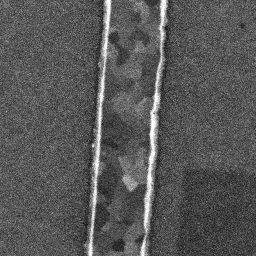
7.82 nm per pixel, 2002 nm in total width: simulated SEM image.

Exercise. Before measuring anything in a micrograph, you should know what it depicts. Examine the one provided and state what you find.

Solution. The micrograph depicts one or a few lines or trenches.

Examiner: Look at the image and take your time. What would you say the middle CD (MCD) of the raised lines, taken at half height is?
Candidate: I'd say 0.42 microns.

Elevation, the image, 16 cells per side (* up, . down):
.......***......
.......***......
.......***......
.......***......
......****......
......****......
......****......
......****......
......****......
......****......
......***.......
......***.......
......***.......
......***.......
......***.......
......***.......